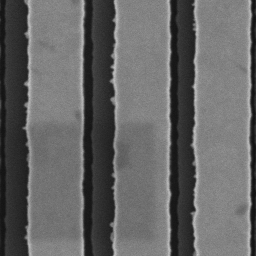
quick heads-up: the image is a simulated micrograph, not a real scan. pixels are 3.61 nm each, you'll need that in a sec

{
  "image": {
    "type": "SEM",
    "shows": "lines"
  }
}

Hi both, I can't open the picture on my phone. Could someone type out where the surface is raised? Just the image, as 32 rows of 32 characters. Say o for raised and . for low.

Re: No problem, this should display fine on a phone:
...oooooooo...ooooooo...ooooooo.
...oooooooo...ooooooo...ooooooo.
...ooooooo....ooooooo...ooooooo.
...ooooooo....ooooooo...ooooooo.
....oooooo....ooooooo...ooooooo.
...ooooooo....ooooooo...ooooooo.
...ooooooo....ooooooo...ooooooo.
....oooooo....ooooooo...ooooooo.
...ooooooo....ooooooo...ooooooo.
....oooooo....ooooooo...ooooooo.
...ooooooo....ooooooo...ooooooo.
...ooooooo....ooooooo...ooooooo.
....oooooo....ooooooo...ooooooo.
...ooooooo....ooooooo...ooooooo.
...ooooooo....ooooooo...ooooooo.
...ooooooo....ooooooo...ooooooo.
...ooooooo....ooooooo...ooooooo.
...ooooooo....ooooooo...ooooooo.
....oooooo....ooooooo...ooooooo.
....oooooo....ooooooo...ooooooo.
....oooooo....ooooooo...ooooooo.
....oooooo....ooooooo...ooooooo.
....oooooo....ooooooo...ooooooo.
...ooooooo....ooooooo...ooooooo.
...ooooooo....ooooooo...ooooooo.
...ooooooo....ooooooo...ooooooo.
...ooooooo....ooooooo...ooooooo.
...ooooooo....ooooooo...ooooooo.
...ooooooo....ooooooo...ooooooo.
...ooooooo....ooooooo...ooooooo.
...ooooooo....ooooooo...ooooooo.
....oooooo....ooooooo...ooooooo.